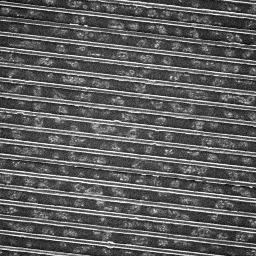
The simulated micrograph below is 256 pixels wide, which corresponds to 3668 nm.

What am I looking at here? parallel lines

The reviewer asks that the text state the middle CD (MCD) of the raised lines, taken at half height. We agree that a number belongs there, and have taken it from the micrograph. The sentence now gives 51.6 nm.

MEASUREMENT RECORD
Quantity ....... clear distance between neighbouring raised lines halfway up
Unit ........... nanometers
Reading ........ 171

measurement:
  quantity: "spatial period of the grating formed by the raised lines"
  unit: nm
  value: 217